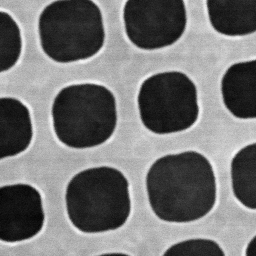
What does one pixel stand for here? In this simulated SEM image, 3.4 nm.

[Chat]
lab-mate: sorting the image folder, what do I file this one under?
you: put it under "holes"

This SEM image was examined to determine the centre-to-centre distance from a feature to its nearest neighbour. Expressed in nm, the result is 288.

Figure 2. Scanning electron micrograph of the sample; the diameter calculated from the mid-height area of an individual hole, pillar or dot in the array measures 229 nm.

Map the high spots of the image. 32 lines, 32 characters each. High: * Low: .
******......****.......***......
.****........**........***......
..***........**........***......
..***........***.......****.....
...**........***.......******.**
...**........****....***********
...***......********************
..*****...**********************
.****************************...
*******************....*****....
**********..******......****....
*******.......***........***....
..*****.......***........***....
...***.........**........***....
....**.........***.......****...
....***........***......********
....***.......*****...**********
....***......*******************
...******..*******************..
.********************....****...
*******************.......***...
**********.....***.........**...
*********.......**.........**...
....****........**.........**...
.....***........**.........**...
.....***........***........***..
.....***........***.......******
......***.......****....********
.....****......*****************
....****************************
**********************.....****.
*********************.......***.